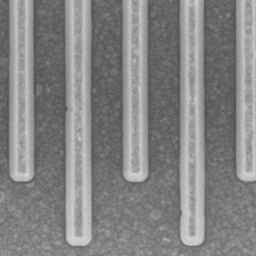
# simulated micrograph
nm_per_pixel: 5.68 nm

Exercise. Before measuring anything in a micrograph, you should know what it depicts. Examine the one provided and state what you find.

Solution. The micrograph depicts parallel lines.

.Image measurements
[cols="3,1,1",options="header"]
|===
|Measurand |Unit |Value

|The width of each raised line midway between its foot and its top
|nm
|102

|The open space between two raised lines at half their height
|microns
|0.22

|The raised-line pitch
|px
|56.9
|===